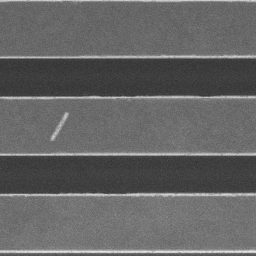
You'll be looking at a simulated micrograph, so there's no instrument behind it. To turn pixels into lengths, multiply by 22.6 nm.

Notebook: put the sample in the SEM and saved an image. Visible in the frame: lines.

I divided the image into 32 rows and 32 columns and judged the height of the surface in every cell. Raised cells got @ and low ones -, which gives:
@@@@@@@@@@@@@@@@@@@@@@@@@@@@@@@@
@@@@@@@@@@@@@@@@@@@@@@@@@@@@@@@@
@@@@@@@@@@@@@@@@@@@@@@@@@@@@@@@@
@@@@@@@@@@@@@@@@@@@@@@@@@@@@@@@@
@@@@@@@@@@@@@@@@@@@@@@@@@@@@@@@@
@@@@@@@@@@@@@@@@@@@@@@@@@@@@@@@@
@@@@@@@@@@@@@@@@@@@@@@@@@@@@@@@@
--------------------------------
--------------------------------
--------------------------------
--------------------------------
--------------------------------
@@@@@@@@@@@@@@@@@@@@@@@@@@@@@@@@
@@@@@@@@@@@@@@@@@@@@@@@@@@@@@@@@
@@@@@@@@@@@@@@@@@@@@@@@@@@@@@@@@
@@@@@@@@@@@@@@@@@@@@@@@@@@@@@@@@
@@@@@@@@@@@@@@@@@@@@@@@@@@@@@@@@
@@@@@@@@@@@@@@@@@@@@@@@@@@@@@@@@
@@@@@@@@@@@@@@@@@@@@@@@@@@@@@@@@
--------------------------------
--------------------------------
--------------------------------
--------------------------------
--------------------------------
@@@@@@@@@@@@@@@@@@@@@@@@@@@@@@@@
@@@@@@@@@@@@@@@@@@@@@@@@@@@@@@@@
@@@@@@@@@@@@@@@@@@@@@@@@@@@@@@@@
@@@@@@@@@@@@@@@@@@@@@@@@@@@@@@@@
@@@@@@@@@@@@@@@@@@@@@@@@@@@@@@@@
@@@@@@@@@@@@@@@@@@@@@@@@@@@@@@@@
@@@@@@@@@@@@@@@@@@@@@@@@@@@@@@@@
@@@@@@@@@@@@@@@@@@@@@@@@@@@@@@@@